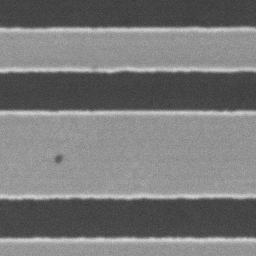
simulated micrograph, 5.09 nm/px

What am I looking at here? lines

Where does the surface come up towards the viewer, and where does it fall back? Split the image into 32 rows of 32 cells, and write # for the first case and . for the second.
................................
................................
................................
................................
################################
################################
################################
################################
################################
................................
................................
................................
................................
................................
################################
################################
################################
################################
################################
################################
################################
################################
################################
################################
################################
................................
................................
................................
................................
................................
################################
################################